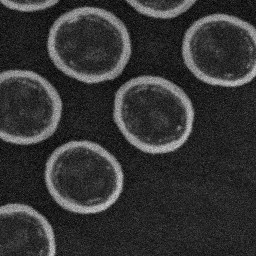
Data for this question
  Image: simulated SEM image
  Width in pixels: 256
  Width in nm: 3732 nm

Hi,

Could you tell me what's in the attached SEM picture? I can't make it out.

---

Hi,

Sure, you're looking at raised bodies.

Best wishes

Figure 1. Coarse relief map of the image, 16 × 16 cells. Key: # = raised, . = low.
.#.......##.....
....###.....###.
...#####....####
...#####....####
....###.....####
###.....###.....
####...#####....
###....#####....
###.....####....
....##..........
...####.........
...####.........
....###.........
##..............
###.............
###.............